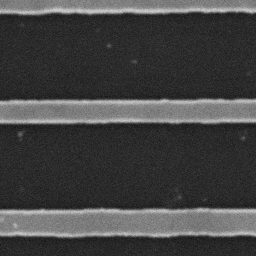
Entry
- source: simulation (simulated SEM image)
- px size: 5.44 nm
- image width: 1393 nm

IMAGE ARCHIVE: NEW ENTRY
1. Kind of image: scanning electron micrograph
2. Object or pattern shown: lines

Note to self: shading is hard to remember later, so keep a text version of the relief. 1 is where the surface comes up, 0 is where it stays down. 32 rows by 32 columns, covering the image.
11111111111111111111111111111111
01111100000000000000000000000000
00000000000000000000000000000000
00000000000000000000000000000000
00000000000000000000000000000000
00000000000000000000000000000000
00000000000000000000000000000000
00000000000000000000000000000000
00000000000000000000000000000000
00000000000000000000000000000000
00000000000000000000000000000000
00000000000000000000000000000000
00000000000000000000000000000000
11111111111111111111111111111111
11111111111111111111111111111111
00000000000000000000000000000000
00000000000000000000000000000000
00000000000000000000000000000000
00000000000000000000000000000000
00000000000000000000000000000000
00000000000000000000000000000000
00000000000000000000000000000000
00000000000000000000000000000000
00000000000000000000000000000000
00000000000000000000000000000000
00000000000000000000000000000000
11111111111111111111111111111111
11111111111111111111111111111111
11111111111111111111111111111111
00000000110000000000000000000000
00000000000000000000000000000000
00000000000000000000000000000000